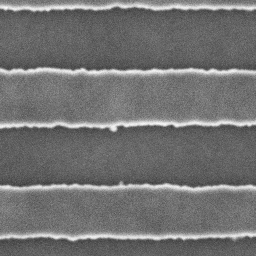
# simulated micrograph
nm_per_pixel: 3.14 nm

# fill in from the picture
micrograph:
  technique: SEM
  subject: lines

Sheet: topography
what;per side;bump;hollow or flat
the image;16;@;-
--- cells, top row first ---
@@@@@@@--@@@@@@@
----------------
----------------
----------------
@@@@@@@@@@@@@@@@
@@@@@@@@@@@@@@@@
@@@@@@@@@@@@@@@@
@@@@@@@@@@@@@@@@
----------------
----------------
----------------
----------------
@@@@@@@@@@@@@@@@
@@@@@@@@@@@@@@@@
@@@@@@@@@@@@@@@@
----------------